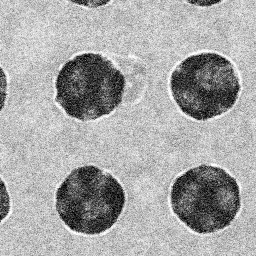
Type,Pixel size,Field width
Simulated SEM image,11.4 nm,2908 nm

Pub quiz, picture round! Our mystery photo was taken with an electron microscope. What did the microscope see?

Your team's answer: holes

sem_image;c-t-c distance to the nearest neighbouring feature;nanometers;1240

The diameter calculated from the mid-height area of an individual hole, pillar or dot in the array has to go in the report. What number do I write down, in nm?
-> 799